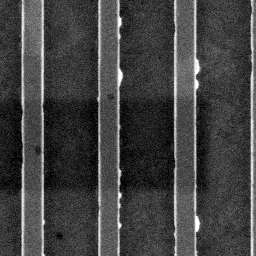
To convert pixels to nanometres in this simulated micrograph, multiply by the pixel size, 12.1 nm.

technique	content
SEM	lines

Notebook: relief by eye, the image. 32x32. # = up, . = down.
...##.......###.......##.......#
...##.......###.......##.......#
...##.......###.......##.......#
...##.......###.......##.......#
...##.......###.......##.......#
...##.......###.......##.......#
...##.......###.......##........
...##.......###.......##........
...##.......###.......##........
...##.......###.......##.......#
...##.......###.......##.......#
...##.......###.......##.......#
...##.......###.......##.......#
...##.......###.......##.......#
...##.......###.......##.......#
...##.......###.......##.......#
...##.......###.......##.......#
...##.......###.......##.......#
...##.......###.......##.......#
...##.......###.......##.......#
...##.......###.......##.......#
...##.......###.......##.......#
...##.......###.......##........
...##.......###.......##.......#
...##.......###.......##.......#
...##.......###.......##.......#
...##.......###.......##.......#
...##.......###.......##.......#
...##.......###.......##.......#
...##.......###.......##.......#
...##.......###.......##.......#
...##.......###.......##.......#